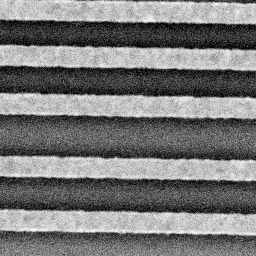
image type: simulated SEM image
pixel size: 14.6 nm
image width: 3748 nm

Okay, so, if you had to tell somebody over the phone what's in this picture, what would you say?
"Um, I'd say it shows lines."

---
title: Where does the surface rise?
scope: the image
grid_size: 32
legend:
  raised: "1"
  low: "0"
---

11111111111111111111111111111000
11111111111111111111111111111111
00000001111111111111111111111111
00000000000000000000000000000000
00000000000000000000000000000000
00000000000000000000000000000000
11111111111111111111111111111111
11111111111111111111111111111111
00000000000000000000000111111111
00000000000000000000000000000000
00000000000000000000000000000000
00000000000000000000000000000000
11111111111111111111111111111111
11111111111111111111111111111111
00000000000000000000001111111111
00000000000000000000000000000000
00000000000000000000000000000000
00000000000000000000000000000000
00000000000000000000000000000000
00000000000000000000000000000000
11111111111111111111111111111111
11111111111111111111111111111111
00000000000000000000000000000000
00000000000000000000000000000000
00000000000000000000000000000000
00000000000000000000000000000000
11111111100000000000000000000000
11111111111111111111111111111111
11111111111111111111111111111111
00000000000000000000000000000000
00000000000000000000000000000000
00000000000000000000000000000000